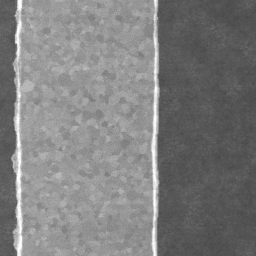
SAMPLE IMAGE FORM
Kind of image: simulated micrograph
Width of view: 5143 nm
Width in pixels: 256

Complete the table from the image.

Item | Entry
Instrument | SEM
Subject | one or a few lines or trenches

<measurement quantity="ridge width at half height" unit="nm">2730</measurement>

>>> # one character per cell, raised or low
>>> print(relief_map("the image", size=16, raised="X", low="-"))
-XXXXXXXXX------
-XXXXXXXXX------
-XXXXXXXXX------
-XXXXXXXXX------
-XXXXXXXXX------
-XXXXXXXXX------
-XXXXXXXXX------
-XXXXXXXXX------
-XXXXXXXXX------
-XXXXXXXXX------
-XXXXXXXXX------
-XXXXXXXXX------
-XXXXXXXXX------
-XXXXXXXXX------
-XXXXXXXXX------
-XXXXXXXXX------